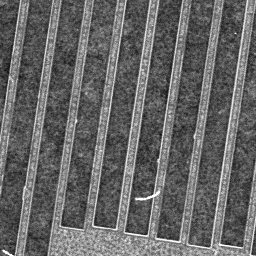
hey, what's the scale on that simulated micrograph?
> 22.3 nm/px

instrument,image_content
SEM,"parallel lines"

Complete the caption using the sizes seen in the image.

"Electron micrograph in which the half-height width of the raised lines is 0.174 um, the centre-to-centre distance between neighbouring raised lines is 715 nm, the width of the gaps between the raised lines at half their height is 537 nanometres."